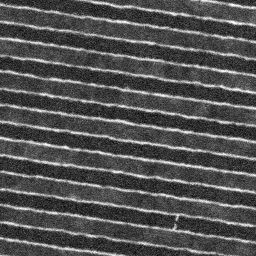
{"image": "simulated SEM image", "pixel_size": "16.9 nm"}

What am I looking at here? parallel lines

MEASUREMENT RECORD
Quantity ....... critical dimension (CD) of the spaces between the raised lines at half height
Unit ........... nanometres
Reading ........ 271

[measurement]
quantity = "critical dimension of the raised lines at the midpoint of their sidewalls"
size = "288 nanometres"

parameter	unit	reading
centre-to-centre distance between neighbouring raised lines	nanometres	558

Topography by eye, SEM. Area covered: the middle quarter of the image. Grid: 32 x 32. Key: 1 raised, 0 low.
00111111111111111111111111111111
00000000011111111111111111111111
00000000000000000111111111111111
00000000000000000000000111111111
11000000000000000000000000001001
11111111100000000000000000000000
11111111111111000000000000000000
11111111111111111111100000000000
11111111111111111111111111111100
00000000111111111111111111111111
00000000000000011111111111111111
00000000000000000000111111111111
00000000000000000000000000011111
11111100000000000000000000000000
11111111111111100000000000000000
11111111111111111111000000000000
11111111111111111111111111110000
00000111111111111111111111111111
00000000000011111111111111111111
00000000000000000011111111111111
00000000000000000000000000111111
11110000000000000000000000000000
11111111111000000000000000000000
11111111111111111000000000000000
11111111111111111111111110000000
00011111111111111111111111111110
00000000000111111111111111111111
00000000000000001111111111111111
00000000000000000000000011111111
11000000000000000000000000000011
11111111000000000000000000000000
11111111111111000000000000000000